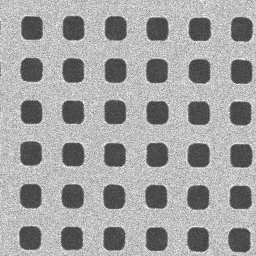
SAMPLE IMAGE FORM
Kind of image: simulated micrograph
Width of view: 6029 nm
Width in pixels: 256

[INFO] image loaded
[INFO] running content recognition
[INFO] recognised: a regular array of holes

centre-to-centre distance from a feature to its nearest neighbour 976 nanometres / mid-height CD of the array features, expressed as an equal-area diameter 25.1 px